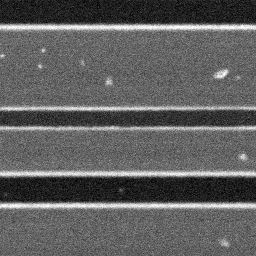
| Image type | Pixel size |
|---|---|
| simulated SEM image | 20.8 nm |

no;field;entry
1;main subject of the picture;lines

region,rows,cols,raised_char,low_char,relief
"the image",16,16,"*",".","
................
................
****************
****************
****************
****************
****************
****************
****************
****************
****************
................
................
****************
****************
****************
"